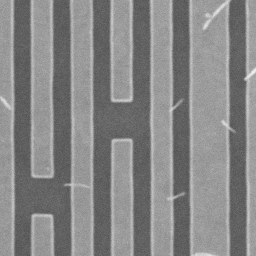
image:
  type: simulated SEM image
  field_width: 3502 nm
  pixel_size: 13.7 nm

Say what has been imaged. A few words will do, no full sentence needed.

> groups of lines, slits or small figures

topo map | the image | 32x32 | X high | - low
XX--XX---XX---XX---XX---XXXXX--X
XX--XX---XX---XX---XX---XXXX---X
XX--XX---XX---XX---XX---XXXX---X
XX--XX---XX---XX---XX---XXXX---X
XX--XX---XX---XX---XX---XXXX---X
XX--XX---XX---XX---XX---XXXX---X
XX--XX---XX---XX---XX---XXXX---X
XX--XX---XX---XX---XX---XXXX---X
XX--XX---XX---XX---XX---XXXX---X
XX--XX---XX---XX---XX---XXXX---X
XX--XX---XX---XX---XX---XXXX---X
XX--XX---XX---XX---XX---XXXX---X
XX--XX---XX---XX---XX---XXXX---X
XX--XX---XX--------XXX--XXXX---X
XX--XX---XX--------XX---XXXX---X
XX--XX---XX--------XX---XXXXX--X
XX--XX---XXX-------XX---XXXXX--X
XX--XX---XXX-------XX---XXXX---X
XX--XX---XXX--XX---XX---XXXX---X
XX--XX---XX---XX---XX---XXXX---X
XX--XXX--XX---XX---XX---XXXX---X
XX--XXX--XXX--XX---XX---XXXX---X
XX-------XXX--XX---XX---XXXX---X
XX-------XX---XX---XX---XXXX---X
XX-------XXX--XXX--XXX--XXXX---X
XX-------XXX--XXX--XXX--XXXX---X
XX-------XXX--XX---XXX--XXXX---X
XX--XX---XXX--XXX--XXX--XXXX---X
XX--XXX--XXX--XXX--XXX--XXXX---X
XX--XXX--XXX--XXX--XXX--XXXXX--X
XX--XXX--XXX--XXX--XXX--XXXXX--X
XX--XXX--XXX--XXX--XXX--XXXXX--X